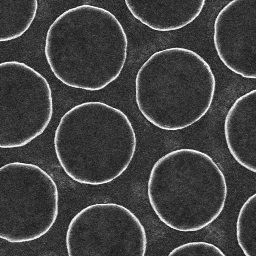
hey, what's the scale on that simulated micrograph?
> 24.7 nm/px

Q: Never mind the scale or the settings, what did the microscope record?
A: raised bodies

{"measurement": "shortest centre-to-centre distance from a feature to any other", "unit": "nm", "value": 2370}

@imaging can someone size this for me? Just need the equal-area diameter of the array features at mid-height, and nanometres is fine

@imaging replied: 1970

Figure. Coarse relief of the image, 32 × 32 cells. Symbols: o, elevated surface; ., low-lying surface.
ooooo...........ooooooooo....ooo
oooo....ooooo...ooooooooo...oooo
oooo...oooooooo..ooooooo...ooooo
ooo...ooooooooo....ooo.....ooooo
oo....oooooooooo...........ooooo
......oooooooooo...........ooooo
......oooooooooo....oooo...ooooo
......oooooooooo...oooooo...oooo
oooo..ooooooooo...oooooooo...ooo
ooooo..oooooooo..oooooooooo...oo
oooooo..ooooo....oooooooooo.....
oooooo...........oooooooooo....o
oooooo...........ooooooooo....oo
oooooo...ooooo...ooooooooo...ooo
oooooo..oooooooo..ooooooo....ooo
oooooo.ooooooooo...ooooo....oooo
ooooo..oooooooooo...........oooo
oooo...oooooooooo...........oooo
.......oooooooooo............ooo
.......oooooooooo....ooooo...ooo
.oo.....oooooooo....ooooooo...oo
ooooo...ooooooo....ooooooooo....
oooooo....oooo.....ooooooooo....
ooooooo............ooooooooo....
ooooooo............ooooooooo....
ooooooo............ooooooooo...o
ooooooo...oooooo...oooooooo...oo
ooooooo..oooooooo...ooooooo...oo
oooooo...ooooooooo....ooo.....oo
ooooo...oooooooooo............oo
........oooooooooo......oo....oo
.........ooooooooo....oooooo...o